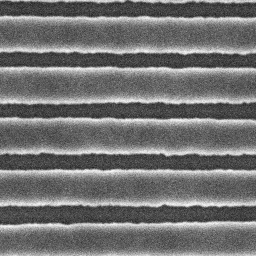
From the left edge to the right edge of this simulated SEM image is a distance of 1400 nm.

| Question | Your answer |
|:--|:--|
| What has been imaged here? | lines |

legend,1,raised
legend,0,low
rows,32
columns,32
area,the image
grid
00000000000000000000000000000000
00000000000000000000000000000000
11111111111111111111111111111111
11111111111111111111111111111111
11111111111111111111111111111111
11111111111111111111111111111111
00000000001101111011111111111111
00000000000000000000000000000000
11111011110011100011100000000000
11111111111111111111111111111111
11111111111111111111111111111111
11111111111111111111111111111111
11111111111111111111111111111111
00000000000000000000000000000000
00000000000000000000000000000000
11111111111111111111111111111111
11111111111111111111111111111111
11111111111111111111111111111111
11111111111111111111111111111111
00000000000000000000000000000000
00000000000000000000000000000000
11111111111111111111111111111111
11111111111111111111111111111111
11111111111111111111111111111111
11111111111111111111111111111111
11111111111111111111111111111111
00000000000000000000000000000000
00000000000000000000000000000000
11111111111111111111111111111111
11111111111111111111111111111111
11111111111111111111111111111111
11111111111111111111111111111111